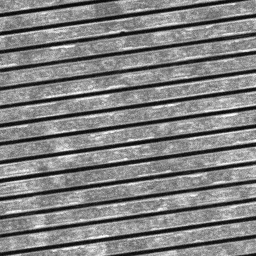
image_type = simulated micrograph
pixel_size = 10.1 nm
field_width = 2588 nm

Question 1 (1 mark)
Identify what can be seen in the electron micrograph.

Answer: parallel lines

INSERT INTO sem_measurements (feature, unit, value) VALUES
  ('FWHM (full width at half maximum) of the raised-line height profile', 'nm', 138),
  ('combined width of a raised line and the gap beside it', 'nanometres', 184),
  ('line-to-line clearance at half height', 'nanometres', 46.3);